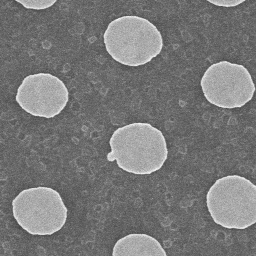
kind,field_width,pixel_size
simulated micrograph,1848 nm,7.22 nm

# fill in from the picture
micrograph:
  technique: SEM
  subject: raised bodies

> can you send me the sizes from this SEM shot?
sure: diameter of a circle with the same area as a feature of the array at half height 366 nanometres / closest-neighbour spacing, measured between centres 106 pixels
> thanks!